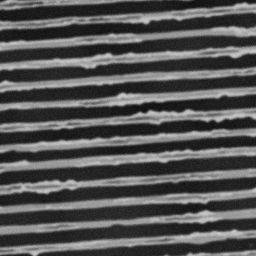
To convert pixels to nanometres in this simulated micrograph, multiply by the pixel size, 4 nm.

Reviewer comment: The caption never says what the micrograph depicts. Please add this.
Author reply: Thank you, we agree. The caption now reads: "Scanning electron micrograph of parallel lines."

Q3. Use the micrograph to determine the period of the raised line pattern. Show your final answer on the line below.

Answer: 20.4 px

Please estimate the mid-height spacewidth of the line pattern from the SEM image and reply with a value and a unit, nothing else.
51.4 nm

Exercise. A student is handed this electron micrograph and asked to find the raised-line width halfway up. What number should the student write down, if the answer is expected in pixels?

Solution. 7.35